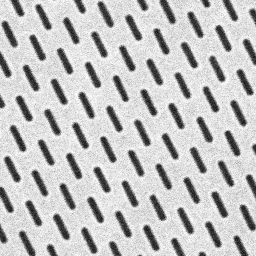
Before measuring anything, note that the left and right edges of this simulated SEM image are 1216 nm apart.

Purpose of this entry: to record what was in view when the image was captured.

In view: a regular array of holes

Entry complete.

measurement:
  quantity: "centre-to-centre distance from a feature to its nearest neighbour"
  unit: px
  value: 30.8